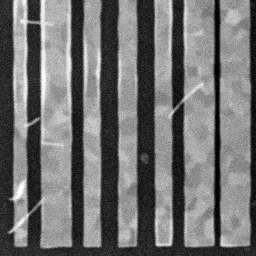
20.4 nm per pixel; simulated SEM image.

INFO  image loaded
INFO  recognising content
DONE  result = groups of lines, slits or small figures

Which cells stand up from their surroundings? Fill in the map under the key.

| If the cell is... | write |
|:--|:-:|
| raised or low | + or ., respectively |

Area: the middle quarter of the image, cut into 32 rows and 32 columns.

+....++++.....++++.....++++...++
+....++++.....++++.....++++...++
+....++++.....++++.....++++...++
+....++++.....++++.....++++...++
+....++++.....++++.....++++...++
+....++++.....++++.....++++...++
+....++++.....++++.....++++...++
+....++++.....++++.....++++...++
+....++++.....++++.....++++...++
++...++++.....++++.....++++...++
++...++++.....++++.....++++...++
++...++++.....++++.....++++...++
++...++++.....++++.....++++...++
++...++++.....++++.....++++...++
++...++++.....++++.....++++...++
++...++++.....++++.....++++...++
++...++++.....++++.....++++...++
++...++++.....++++.....++++...++
++...++++.....++++.....++++...++
++...++++.....++++.....++++...++
++...++++.....++++.....++++...++
++...++++.....++++.....++++...++
++...++++.....++++.....++++...++
++...++++.....++++.....++++...++
++...++++.....++++.....++++...++
++...++++.....++++.....++++...++
++...++++.....++++.....++++...++
++...++++.....++++.....++++...++
++...++++.....++++.....++++...++
++...++++.....++++.....++++...++
++...++++.....++++.....++++...++
++...++++.....++++.....++++...++